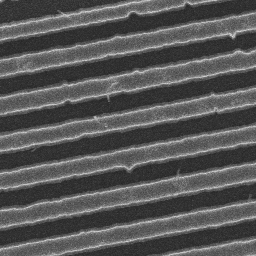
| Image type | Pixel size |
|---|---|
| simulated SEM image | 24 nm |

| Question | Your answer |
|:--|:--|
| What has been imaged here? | parallel lines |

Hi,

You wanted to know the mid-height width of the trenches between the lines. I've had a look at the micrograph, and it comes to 445 nm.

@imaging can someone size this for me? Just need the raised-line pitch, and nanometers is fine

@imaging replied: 882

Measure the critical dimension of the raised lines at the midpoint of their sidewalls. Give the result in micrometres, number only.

0.422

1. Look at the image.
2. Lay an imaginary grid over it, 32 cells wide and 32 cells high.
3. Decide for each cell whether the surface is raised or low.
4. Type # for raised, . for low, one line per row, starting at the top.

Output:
...............##########.......
..........##########............
.....#########............######
#########............###########
####............############....
...........###########..........
.....############............###
############............########
######.............#############
#.............#############.....
........#############...........
...############.#............###
##########..............########
#####.............############..
.............############.......
........###########.............
..############.............#####
########..............##########
###.............#############...
...........############.........
......############.............#
#############............#######
#######.............############
##.............#############....
.........#############..........
....############.............###
###########.............########
######.............############.
..............############......
........############............
..#############.............####
#########.............##########